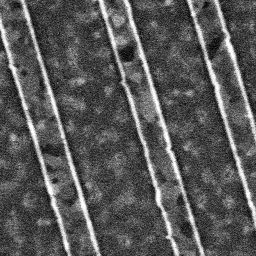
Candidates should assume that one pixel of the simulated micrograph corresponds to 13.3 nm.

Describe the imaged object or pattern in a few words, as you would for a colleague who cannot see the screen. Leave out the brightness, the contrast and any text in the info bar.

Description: one or a few lines or trenches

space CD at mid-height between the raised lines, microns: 0.969